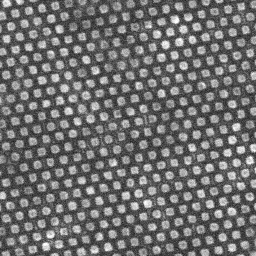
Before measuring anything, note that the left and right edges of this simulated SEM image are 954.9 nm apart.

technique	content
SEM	a regular array of raised bodies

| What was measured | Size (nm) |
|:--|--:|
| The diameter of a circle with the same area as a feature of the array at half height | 28.5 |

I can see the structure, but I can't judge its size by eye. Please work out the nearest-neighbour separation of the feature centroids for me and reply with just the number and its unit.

49.7 nm